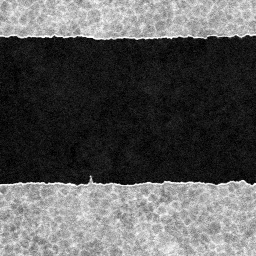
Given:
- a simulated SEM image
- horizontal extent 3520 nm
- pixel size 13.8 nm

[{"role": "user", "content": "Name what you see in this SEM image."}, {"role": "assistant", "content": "one or a few lines or trenches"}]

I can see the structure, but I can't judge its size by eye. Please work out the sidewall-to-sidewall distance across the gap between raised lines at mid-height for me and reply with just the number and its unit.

2010 nm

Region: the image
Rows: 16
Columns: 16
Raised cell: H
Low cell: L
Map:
HHHHHHHHHHHHHHHH
HHHHHHHHHHHHHHHH
LLLLLLLLLLLLLLLL
LLLLLLLLLLLLLLLL
LLLLLLLLLLLLLLLL
LLLLLLLLLLLLLLLL
LLLLLLLLLLLLLLLL
LLLLLLLLLLLLLLLL
LLLLLLLLLLLLLLLL
LLLLLLLLLLLLLLLL
LLLLLLLLLLLLLLLL
LHHHLHLLLHHHHLHH
HHHHHHHHHHHHHHHH
HHHHHHHHHHHHHHHH
HHHHHHHHHHHHHHHH
HHHHHHHHHHHHHHHH